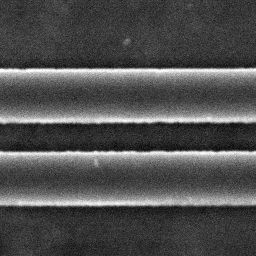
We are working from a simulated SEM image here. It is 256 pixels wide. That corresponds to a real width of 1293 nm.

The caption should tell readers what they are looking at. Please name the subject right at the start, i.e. lines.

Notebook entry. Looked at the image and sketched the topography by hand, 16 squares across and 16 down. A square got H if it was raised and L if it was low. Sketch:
LLLLLLLLLLLLLLLL
LLLLLLLLLLLLLLLL
LLLLLLLLLLLLLLLL
LLLLLLLLLLLLLLLL
HHHHHHHHHHHHHHHH
HHHHHHHHHHHHHHHH
HHHHHHHHHHHHHHHH
HHHHHHHHHHHHHHHH
LLLLLLLLLLLLLLLL
LLLLLLLLLLLLLLLL
HHHHHHHHHHHHHHHH
HHHHHHHHHHHHHHHH
HHHHHHHHHHHHHHHH
LLLLLLLLLLLLLLLL
LLLLLLLLLLLLLLLL
LLLLLLLLLLLLLLLL